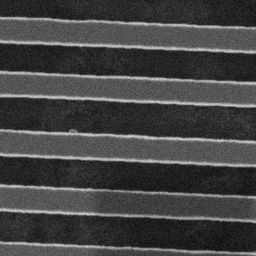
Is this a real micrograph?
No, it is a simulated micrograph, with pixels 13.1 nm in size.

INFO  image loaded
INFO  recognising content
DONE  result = lines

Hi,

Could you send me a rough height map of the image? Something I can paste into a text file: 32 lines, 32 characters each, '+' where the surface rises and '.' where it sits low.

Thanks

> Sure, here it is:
................................
................................
++++++++........................
++++++++++++++++++++++++++++++++
++++++++++++++++++++++++++++++++
......++++++++++++++++++++++++++
............................++++
................................
................................
++++++++++++....................
++++++++++++++++++++++++++++++++
++++++++++++++++++++++++++++++++
.............+++++++++++++++++++
................................
................................
................................
++++++..........................
+++++++++++++++++++++++++++.....
++++++++++++++++++++++++++++++++
.+++++++++++++++++++++++++++++++
........................++++++++
................................
................................
+++++++.........................
++++++++++++++++++++++++++++++..
++++++++++++++++++++++++++++++++
...+++++++++++++++++++++++++++++
............................++++
................................
................................
+++++...........................
+++++++++++++++++++++++++++.....